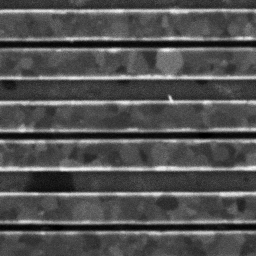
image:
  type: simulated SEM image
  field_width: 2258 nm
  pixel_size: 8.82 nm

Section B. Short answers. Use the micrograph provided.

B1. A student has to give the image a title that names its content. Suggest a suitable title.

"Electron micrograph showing parallel lines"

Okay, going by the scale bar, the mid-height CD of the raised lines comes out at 0.259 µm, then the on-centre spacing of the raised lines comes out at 404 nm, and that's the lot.